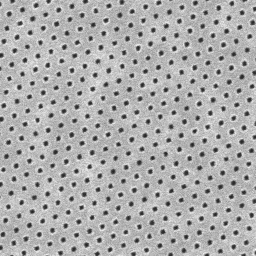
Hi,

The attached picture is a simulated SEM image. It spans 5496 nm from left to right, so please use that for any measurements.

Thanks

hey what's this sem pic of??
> a regular array of holes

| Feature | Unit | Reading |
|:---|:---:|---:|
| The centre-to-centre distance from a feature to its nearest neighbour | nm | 288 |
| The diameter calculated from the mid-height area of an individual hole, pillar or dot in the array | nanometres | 114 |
